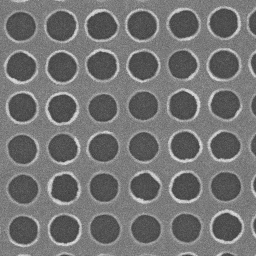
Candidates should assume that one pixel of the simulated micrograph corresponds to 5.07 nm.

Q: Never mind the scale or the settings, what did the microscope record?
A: a regular array of holes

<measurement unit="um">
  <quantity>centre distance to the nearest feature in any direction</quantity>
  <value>0.202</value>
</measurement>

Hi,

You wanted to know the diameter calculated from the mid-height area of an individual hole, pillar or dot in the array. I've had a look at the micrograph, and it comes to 0.147 µm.